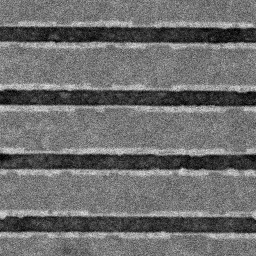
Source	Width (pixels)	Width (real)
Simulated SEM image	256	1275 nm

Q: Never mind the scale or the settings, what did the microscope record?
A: one or a few lines or trenches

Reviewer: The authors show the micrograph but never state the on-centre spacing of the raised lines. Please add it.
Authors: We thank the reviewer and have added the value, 316 nanometers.